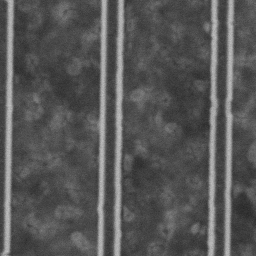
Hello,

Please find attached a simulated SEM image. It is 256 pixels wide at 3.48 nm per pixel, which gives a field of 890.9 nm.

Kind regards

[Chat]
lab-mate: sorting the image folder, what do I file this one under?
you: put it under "one or a few lines or trenches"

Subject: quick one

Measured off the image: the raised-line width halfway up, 61.4 nm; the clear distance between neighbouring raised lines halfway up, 93.2 pixels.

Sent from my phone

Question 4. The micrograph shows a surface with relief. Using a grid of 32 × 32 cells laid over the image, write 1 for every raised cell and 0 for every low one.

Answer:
10000000000001100000000000011000
10000000000001100000000000011000
10000000000001100000000000011000
10000000000001100000000000011000
10000000000001100000000000011000
10000000000001100000000000011000
10000000000001100000000000011000
10000000000001100000000000011000
10000000000001100000000000011000
10000000000001100000000000011000
10000000000001100000000000011000
10000000000001100000000000011000
10000000000001100000000000011000
10000000000001100000000000011000
10000000000001100000000000011000
10000000000001100000000000011000
10000000000001100000000000011000
10000000000001100000000000011000
10000000000001100000000000011000
10000000000001100000000000111000
10000000000001100000000000111000
10000000000001100000000000111000
10000000000001100000000000111000
10000000000001100000000000111000
10000000000001100000000000111000
10000000000001100000000000111000
10000000000001100000000000010000
10000000000001100000000000110000
10000000000001100000000000110000
10000000000001100000000000110000
10000000000001100000000000110000
10000000000001100000000000110000